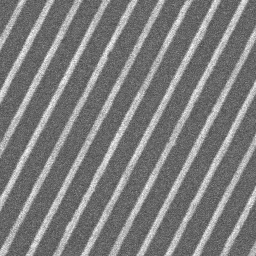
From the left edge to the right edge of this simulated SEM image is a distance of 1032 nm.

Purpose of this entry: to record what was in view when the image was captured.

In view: parallel lines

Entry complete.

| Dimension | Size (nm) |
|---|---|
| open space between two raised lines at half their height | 76.8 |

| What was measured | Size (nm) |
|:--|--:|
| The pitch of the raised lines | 99.2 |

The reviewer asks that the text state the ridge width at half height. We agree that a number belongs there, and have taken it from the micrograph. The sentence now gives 5.43 pixels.